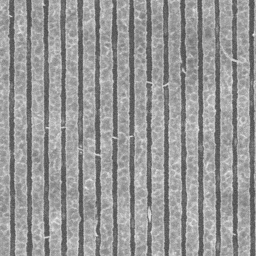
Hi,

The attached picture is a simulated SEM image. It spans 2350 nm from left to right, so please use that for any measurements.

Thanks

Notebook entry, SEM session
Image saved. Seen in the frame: parallel lines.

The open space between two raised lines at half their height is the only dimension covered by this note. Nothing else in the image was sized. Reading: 54 nanometres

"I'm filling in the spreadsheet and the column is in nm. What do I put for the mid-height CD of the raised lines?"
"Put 102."